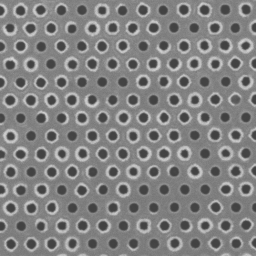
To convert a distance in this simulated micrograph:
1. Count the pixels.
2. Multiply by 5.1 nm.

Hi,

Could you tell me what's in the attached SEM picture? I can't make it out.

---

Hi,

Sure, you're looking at a regular array of holes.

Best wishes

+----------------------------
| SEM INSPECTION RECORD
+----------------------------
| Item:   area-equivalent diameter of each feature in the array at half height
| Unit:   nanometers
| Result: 46.7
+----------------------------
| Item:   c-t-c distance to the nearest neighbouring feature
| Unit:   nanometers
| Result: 103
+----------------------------